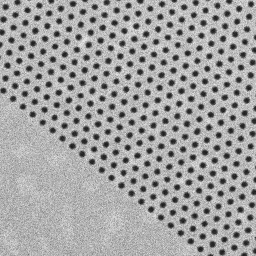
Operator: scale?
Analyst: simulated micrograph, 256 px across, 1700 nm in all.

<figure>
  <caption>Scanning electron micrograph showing a regular array of holes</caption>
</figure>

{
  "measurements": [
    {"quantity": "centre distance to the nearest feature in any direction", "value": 82.6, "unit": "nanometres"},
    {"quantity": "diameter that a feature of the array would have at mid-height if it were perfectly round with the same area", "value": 0.043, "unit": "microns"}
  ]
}